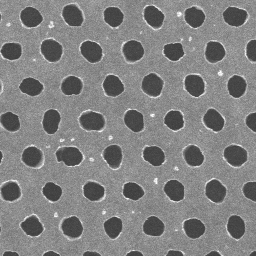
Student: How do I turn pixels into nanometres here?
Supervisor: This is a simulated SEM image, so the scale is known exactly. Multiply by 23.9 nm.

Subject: a regular array of holes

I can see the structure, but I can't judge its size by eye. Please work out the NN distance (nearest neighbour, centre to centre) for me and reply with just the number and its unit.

0.952 microns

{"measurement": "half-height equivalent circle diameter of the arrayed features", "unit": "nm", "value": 493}